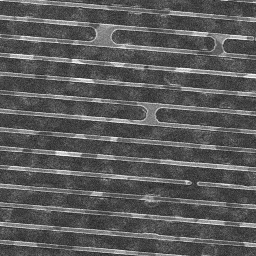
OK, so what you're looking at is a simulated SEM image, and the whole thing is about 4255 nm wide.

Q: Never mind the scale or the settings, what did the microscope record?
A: parallel lines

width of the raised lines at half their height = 60 nanometres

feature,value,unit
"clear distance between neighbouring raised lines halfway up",253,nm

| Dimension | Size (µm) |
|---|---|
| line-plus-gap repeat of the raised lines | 0.31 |